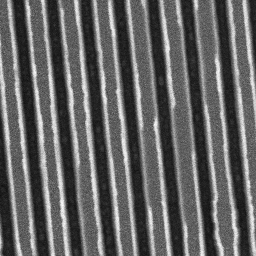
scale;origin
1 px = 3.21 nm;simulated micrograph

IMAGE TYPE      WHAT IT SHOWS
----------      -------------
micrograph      parallel lines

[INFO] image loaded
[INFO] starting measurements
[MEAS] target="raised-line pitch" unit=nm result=108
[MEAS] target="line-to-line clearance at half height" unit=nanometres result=42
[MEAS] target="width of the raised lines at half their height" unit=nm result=67.6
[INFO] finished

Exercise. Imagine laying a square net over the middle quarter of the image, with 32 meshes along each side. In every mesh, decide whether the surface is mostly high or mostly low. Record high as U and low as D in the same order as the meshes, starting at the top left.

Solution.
UUUUUDDDDUUUUUDDDUUUUUDDDDUUUUUD
UUUUUDDDDUUUUUDDDUUUUUDDDDUUUUUD
UUUUUDDDDUUUUUDDDUUUUUDDDDUUUUUD
DUUUUUDDDUUUUUDDDDUUUUDDDDUUUUUD
DUUUUUDDDUUUUUDDDDUUUUUDDDUUUUUD
DUUUUUDDDUUUUUDDDDUUUUUDDDUUUUUD
DUUUUUDDDUUUUUDDDDUUUUUDDDUUUUUD
DUUUUUDDDUUUUUDDDDUUUUUDDDUUUUUD
DUUUUUDDDUUUUUUDDDUUUUUDDDUUUUUD
DUUUUUDDDDUUUUUDDDUUUUUDDDDUUUUD
DUUUUUDDDDUUUUUDDDUUUUUDDDDUUUUU
DUUUUUDDDDUUUUUDDDUUUUUDDDDUUUUU
DUUUUUUDDDUUUUUDDDUUUUUDDDDUUUUU
DDUUUUUDDDUUUUUDDDDUUUUDDDDUUUUU
DDUUUUUDDDUUUUUDDDDUUUUUDDDUUUUU
DDUUUUUDDDUUUUUDDDDUUUUUDDDUUUUU
DDUUUUUDDDUUUUUDDDDUUUUUDDDUUUUU
DDUUUUUDDDUUUUUUDDDUUUUUDDDUUUUU
DDUUUUUDDDUUUUUUDDDUUUUUDDDUUUUU
DDUUUUUDDDDUUUUUDDDUUUUUDDDDUUUU
DDUUUUUDDDDUUUUUDDDUUUUUDDDDUUUU
DDUUUUUDDDDUUUUUDDDUUUUUDDDDUUUU
DDUUUUUDDDDUUUUUDDDUUUUUDDDDUUUU
DDDUUUUDDDDUUUUUDDDDUUUUDDDDUUUU
DDDUUUUUDDDUUUUUDDDDUUUUUDDDUUUU
DDDUUUUUDDDUUUUUDDDDUUUUUDDDUUUU
DDDUUUUUDDDUUUUUDDDDUUUUUDDDUUUU
DDDUUUUUDDDDUUUUDDDDUUUUUDDDUUUU
DDDUUUUUDDDDUUUUDDDDUUUUUDDDUUUU
DDDUUUUUDDDDUUUUUDDDUUUUUDDDDUUU
DDDUUUUUDDDDUUUUUDDDUUUUUDDDDUUU
DDDUUUUUDDDDUUUUUDDDUUUUUDDDDUUU